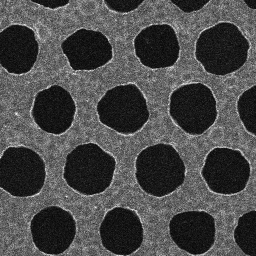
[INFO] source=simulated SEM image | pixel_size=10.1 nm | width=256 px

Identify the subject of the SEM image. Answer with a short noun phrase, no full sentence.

a regular array of holes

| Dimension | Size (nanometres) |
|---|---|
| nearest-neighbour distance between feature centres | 691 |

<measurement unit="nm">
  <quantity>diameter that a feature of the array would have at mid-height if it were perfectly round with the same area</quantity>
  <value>475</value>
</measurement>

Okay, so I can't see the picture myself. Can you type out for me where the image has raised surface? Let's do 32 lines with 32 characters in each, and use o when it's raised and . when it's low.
ooooo...ooooo.....oooo....ooooo.
ooooooooooooooo.ooooooo.oooooooo
oooooooooooooooooooooooooooooooo
o...oooooooooooooo...ooooo....oo
....ooooo....oooo.....ooo.....oo
.....ooo......ooo.....ooo......o
.....ooo......ooo.....oo.......o
.....oooo.....ooo.....ooo......o
o...ooooo...ooooooo.oooooo....oo
oooooooooooooooooooooooooooooooo
oooooooooooooooooooooooo.ooooooo
ooooo....oooo.....oooo....ooooo.
oooo.....oooo.....ooo......ooo..
oooo.....ooo......ooo......ooo..
oooo.....ooo.......oo......ooo..
ooooo....oooo.....oooo.....ooo..
oooooo..ooooooo..oooooo..oooooo.
oooooooooooooooooooooooooooooooo
o..oooooo....ooooo....ooooo.oooo
.....ooo......ooo......ooo....oo
......oo......ooo......ooo.....o
......oo......ooo......oo......o
......oo......ooo......ooo.....o
.....oooo....ooooo....oooo.....o
oo..ooooooooooooooo.oooooooooooo
oooooooooooooooooooooooooooooooo
ooooo...oooooo...oooooo..oooooo.
oooo.....oooo....oooo......ooo..
oooo.....ooo......ooo......oo...
oooo.....ooo......ooo......oo...
oooo.....oooo.....oooo.....ooo..
ooooo...oooooo...oooooo...oooo..